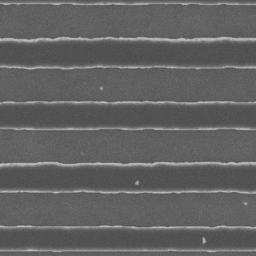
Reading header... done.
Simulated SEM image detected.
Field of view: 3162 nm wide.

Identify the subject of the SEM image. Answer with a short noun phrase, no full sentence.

lines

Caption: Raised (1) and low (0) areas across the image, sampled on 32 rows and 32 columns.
10000011011111111110001111111111
00000000000000000000000000000000
00000000000000000000000000000000
00000000000000000000000000000000
00000000000000000000000000000000
11111111111111111111111111111111
11111111111111111111111111111111
11111111111111111111111111111111
00011001100000000000000010000000
00000000000000000000000000000000
00000000000000000000000000000000
00000000000000000000000000000000
00000000000000000000000000000000
11111111111111111111111111111111
11111111111111111111111111111111
11111111111111111111111111111111
00000000000000000000000000000000
00000000000000000000000000000000
00000000000000000000000000000000
00000000000000000000000000000000
11111111011111101111111111111111
11111111111111111111111111111111
11111111111111111111111111111111
11111111111111111111111111111111
00000000000000000000000000000000
00000000000000000000000000000000
00000000000000000000000000000000
00000000000000000000000000000000
11111111111111111001111111111111
11111111111111111111111111111111
11111111111111111111111111111111
00000000000000000000000000000000